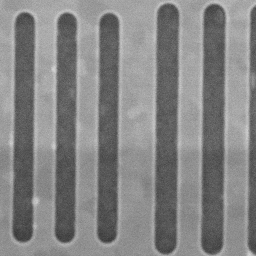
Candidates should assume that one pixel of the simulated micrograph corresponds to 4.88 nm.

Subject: groups of lines, slits or small figures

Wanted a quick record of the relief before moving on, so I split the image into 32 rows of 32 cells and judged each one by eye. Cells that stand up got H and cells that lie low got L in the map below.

HHHHHHHHHHHHHHHHHHHHLLHHHHLHHHHH
HHHHHHHHLHHHHHHHHHHHLLHHHLLLHHHL
HHLLHHHLLLHHLLLHHHHLLLLHHLLLHHHL
HHLLLHHLLLHHLLLHHHHLLLLHHLLLHHHL
HHLLLHHLLLHHLLLHHHHLLLLHHLLLHHHL
HHLLHHHLLLHHLLLHHHHLLLHHHLLLHHHL
HHLLHHHLLLHHLLLHHHHLLLHHHLLLHHHL
HHLLHHHLLLHHLLLHHHHLLLLHHLLLHHHL
HHLLHHHLLLHHLLLHHHHLLLLHHLLLHHHL
HHLLHHHLLLHHLLLHHHHLLLHHHLLLHHHL
HHLLHHHLLLHHLLLHHHHLLLHHHLLLHHHL
HHLLHHHLLLHHLLLHHHHLLLHHHLLLHHHL
HHLLHHHLLLHHLLLHHHHLLLHHHLLLHHHL
HHLLHHHLLLHHLLLHHHHLLLHHHLLLHHHL
HHLLHHHLLLHHLLLHHHHLLLHHHLLLHHHL
HHLLHHHLLLHHLLLHHHHLLLHHHLLLHHHL
HHLLHHHLLLHHLLLHHHHLLLHHHLLLHHHL
HHLLHHHLLLHHLLLHHHHLLLHHHLLLHHHL
HHLLHHHLLLHHLLLHHHHLLLHHHLLLHHHL
HHLLHHHLLLHHLLLHHHHLLLHHHLLLHHHL
HHLLHHHLLLHHLLLHHHHLLLHHHLLLHHHL
HHLLHHHLLLHHLLLHHHHLLLHHHLLLHHHL
HHLLHHHLLLHHLLLHHHHLLLHHHLLLHHHL
HLLLHHHLLLHHLLLHHHHLLLHHHLLLHHHL
HLLLHHHLLLHHLLLHHHHLLLHHHLLLHHHL
HLLLHHHLLLHHLLLHHHHLLLHHHLLLHHHL
HLLLHHHLLLHHLLLHHHHLLLHHHLLLHHHL
HLLLHHHLLLHHLLLHHHHLLLHHHLLLHHHL
HLLLHHHLLLHHLLLHHHHLLLHHHLLLHHHL
HHLLHHHLLHHHLLLHHHHLLLHHHLLLHHHL
HHHHHHHHHHHHHLHHHHHLLLHHHLLLHHHL
HHHHHHHHHHHHHHHHHHHHLLHHHLLLHHHL